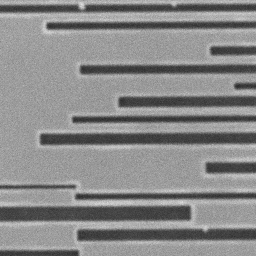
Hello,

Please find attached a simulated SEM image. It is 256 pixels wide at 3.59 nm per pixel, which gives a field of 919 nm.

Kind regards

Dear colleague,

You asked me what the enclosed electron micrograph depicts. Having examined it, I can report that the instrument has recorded groups of lines, slits or small figures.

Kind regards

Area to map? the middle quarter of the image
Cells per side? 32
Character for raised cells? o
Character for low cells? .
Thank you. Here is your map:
oooo............................
oooo............................
oooo............................
oooooooooooooooooooooooooooooooo
oooooooooooooooooooooooooooooooo
oooooooooooooooooooooooooooooooo
oooooooooooooooooooooooooooooooo
oooooooooooooooooooooooooooooooo
oooooooooooooo..................
ooooooooooooo...................
oooooooooooooo..................
oooooooooooooooooooooooooooooooo
oooooooooooooooooooooooooooooooo
oo..............................
oo..............................
oooooooooooooooooooooooooooooooo
oooooooooooooooooooooooooooooooo
................................
................................
................................
oooooooooooooooooooooooooooooooo
oooooooooooooooooooooooooooooooo
oooooooooooooooooooooooooooooooo
oooooooooooooooooooooooooooooooo
oooooooooooooooooooooooooooooooo
oooooooooooooooooooooooooooooooo
oooooooooooooooooooooooooooooooo
oooooooooooooooooooooooooooooooo
oooooooooooooooooooooooooooooooo
oooooooooooooooooooooooooooooooo
...ooooooooooooooooooooooooooooo
oooooooooooooooooooooooooooooooo